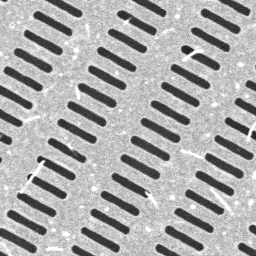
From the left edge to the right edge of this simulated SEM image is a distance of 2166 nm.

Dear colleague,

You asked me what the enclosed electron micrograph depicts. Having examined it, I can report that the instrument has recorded a regular array of holes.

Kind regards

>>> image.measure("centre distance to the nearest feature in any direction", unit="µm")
0.174